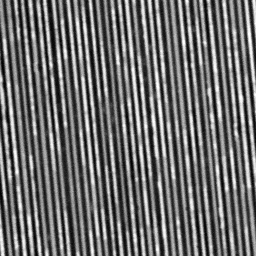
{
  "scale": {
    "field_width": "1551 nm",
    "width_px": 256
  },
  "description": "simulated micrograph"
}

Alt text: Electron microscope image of parallel lines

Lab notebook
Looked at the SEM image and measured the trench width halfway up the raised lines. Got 27.1 nm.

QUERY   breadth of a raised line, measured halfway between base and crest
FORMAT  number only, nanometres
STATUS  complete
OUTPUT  17.3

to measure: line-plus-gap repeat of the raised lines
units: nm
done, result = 44.9